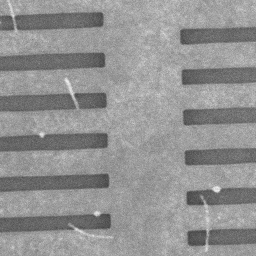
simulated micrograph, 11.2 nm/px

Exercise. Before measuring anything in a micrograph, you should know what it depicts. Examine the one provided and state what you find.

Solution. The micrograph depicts groups of lines, slits or small figures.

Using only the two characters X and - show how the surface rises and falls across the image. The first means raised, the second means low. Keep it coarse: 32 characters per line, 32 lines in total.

XXXXXXXXXXXXXXXXXXXXXXXXXXXXXXXX
XXXXXXXXXX--XXXXXXXXXXXXXXXXXXXX
-------------XXXXXXXXXXXXXXXXXXX
-----------XXXXXXXXXXXXXX-------
XXXXXXXXXXXXXXXXXXXXXX----------
XXXXXXXXXXXXXXXXXXXXXXX---XXXXXX
XXXXXXXXXXXXXXXXXXXXXXXXXXXXXXXX
-------------XXXXXXXXXXXXXXXXXXX
-------------XXXXXXXXXXXXXXX----
XXXXXXXXXXXXXXXXXXXXXXX---------
XXXXXXXXXXXXXXXXXXXXXXX--------X
XXXXXXXXXXX--XXXXXXXXXXXXXXXXXXX
-------------XXXXXXXXXXXXXXXXXXX
-------------XXXXXXXXXXXXX------
XXXXXXXXXXXXXXXXXXXXXXX---------
XXXXXXXXXXXXXXXXXXXXXXX------XXX
XXXXXXXXXXXXXXXXXXXXXXXXXXXXXXXX
--------------XXXXXXXXXXXXXXXXXX
-------------XXXXXXXXXXXXXXX----
XXXXXXXXXXXXXXXXXXXXXXX---------
XXXXXXXXXXXXXXXXXXXXXXX-------XX
XXXXXXXXXXXXXXXXXXXXXXXXXXXXXXXX
--------------XXXXXXXXXXXXXXXXXX
-------------XXXXXXXXXXXXXXX----
XXXXXXXXXXXXXXXXXXXXXXX---------
XXXXXXXXXXXXXXXXXXXXXXXX--------
XXXXXXXXXXXXXXXXXXXXXXXXXXXXXXXX
--------------XXXXXXXXXXXXXXXXXX
--------------XXXXXXXXXXXXXXX---
XXXXXXXXXXXXXXXXXXXXXXX---------
XXXXXXXXXXXXXXXXXXXXXXXX--------
XXXXXXXXXXXXXXXXXXXXXXXXXXXXXXXX